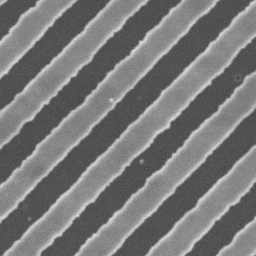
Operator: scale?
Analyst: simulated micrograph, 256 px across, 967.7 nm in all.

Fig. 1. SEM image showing lines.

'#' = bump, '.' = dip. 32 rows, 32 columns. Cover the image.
....#####....#####....#####....#
...#####....#####....#####....##
..#####....#####....#####....###
.#####.....####....#####....####
.####.....####....#####....#####
####.....####....#####....#####.
###.....####....#####....#####..
##.....####....#####....#####...
#....#####....#####....#####....
.....####....#####....#####....#
....####....#####....#####....##
...####.....####....#####....###
..####.....####.....####....####
#####.....####....#####....#####
####....#####.....####....#####.
###....#####....#####....#####..
##....#####.....####....#####...
#....#####.....####....#####....
....#####.....####....#####....#
....####....#####.....####....##
...####.....####.....####....###
..####.....####....#####.....###
.####.....####....#####....#####
####.....####.....####....#####.
###.....####....#####....#####..
##.....####.....####.....####...
#.....####.....####....#####....
.....####.....####....#####.....
....####.....####.....####....##
...####.....####.....####....###
..####....#####.....####.....###
.####.....####.....#####...#####